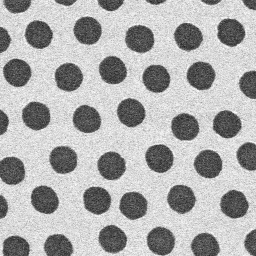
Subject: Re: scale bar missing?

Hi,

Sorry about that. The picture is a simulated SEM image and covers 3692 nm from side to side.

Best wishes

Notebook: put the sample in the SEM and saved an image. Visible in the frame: a regular array of holes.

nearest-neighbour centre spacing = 615 nm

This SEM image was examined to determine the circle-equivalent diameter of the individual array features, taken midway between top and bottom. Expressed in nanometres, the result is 410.